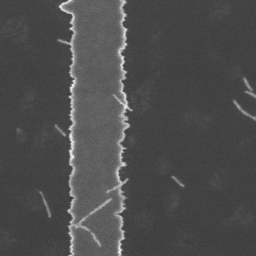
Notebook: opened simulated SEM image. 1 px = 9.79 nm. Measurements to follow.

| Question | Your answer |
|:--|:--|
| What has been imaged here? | one or a few lines or trenches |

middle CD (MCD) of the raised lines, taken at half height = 514 nm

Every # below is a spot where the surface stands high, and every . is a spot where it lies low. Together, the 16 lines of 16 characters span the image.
....####........
....####........
....####........
.....###........
....####........
.....###........
....####........
....####........
....####........
....####........
....####........
....####........
....####........
....####........
....####........
....####........